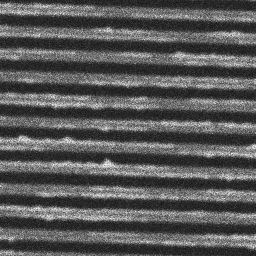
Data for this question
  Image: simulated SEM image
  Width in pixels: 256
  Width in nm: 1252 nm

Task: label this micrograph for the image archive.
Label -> parallel lines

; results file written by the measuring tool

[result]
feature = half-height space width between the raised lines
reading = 0.0556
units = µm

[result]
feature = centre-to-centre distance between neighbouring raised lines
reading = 110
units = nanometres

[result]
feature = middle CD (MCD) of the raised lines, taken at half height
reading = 55.6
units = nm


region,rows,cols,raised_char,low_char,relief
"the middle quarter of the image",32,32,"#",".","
................................
................................
##########......................
################################
################################
...............##.....##########
................................
................................
#####################...........
################################
#.##############################
................................
................................
................................
###############################.
################################
..........#.####################
................................
#...............................
##########......................
################################
################################
......................##########
................................
##........##....................
####################............
################################
.........#######################
................................
................................
................................
################################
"